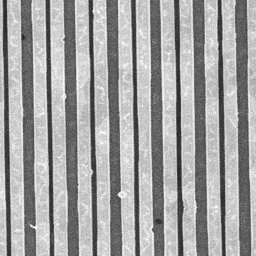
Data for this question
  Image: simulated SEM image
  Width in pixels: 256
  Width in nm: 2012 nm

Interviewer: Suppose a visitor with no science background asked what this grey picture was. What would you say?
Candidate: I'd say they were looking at parallel lines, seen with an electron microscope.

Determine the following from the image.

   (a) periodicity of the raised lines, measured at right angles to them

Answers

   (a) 169 nm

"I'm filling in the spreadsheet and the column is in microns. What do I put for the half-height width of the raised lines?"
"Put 0.0953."